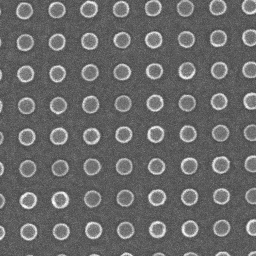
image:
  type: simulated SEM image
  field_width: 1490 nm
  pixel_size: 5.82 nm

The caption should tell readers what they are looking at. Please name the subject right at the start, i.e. a regular array of raised bodies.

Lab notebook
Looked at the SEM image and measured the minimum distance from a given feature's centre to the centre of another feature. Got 0.182 um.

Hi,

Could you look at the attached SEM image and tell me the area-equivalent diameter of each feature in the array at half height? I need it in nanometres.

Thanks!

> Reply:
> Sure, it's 93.